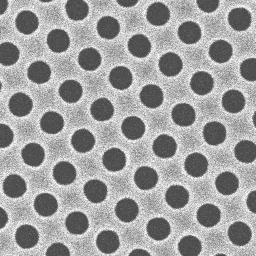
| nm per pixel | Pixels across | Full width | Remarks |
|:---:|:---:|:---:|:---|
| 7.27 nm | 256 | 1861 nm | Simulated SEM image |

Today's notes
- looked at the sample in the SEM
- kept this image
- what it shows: a regular array of holes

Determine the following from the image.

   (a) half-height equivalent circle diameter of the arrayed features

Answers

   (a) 175 nm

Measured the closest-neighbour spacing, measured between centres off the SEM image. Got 0.264 microns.